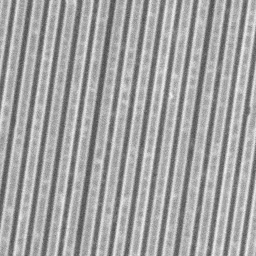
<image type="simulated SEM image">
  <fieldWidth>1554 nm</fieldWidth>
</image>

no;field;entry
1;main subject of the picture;parallel lines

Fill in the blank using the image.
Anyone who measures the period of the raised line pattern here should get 99.4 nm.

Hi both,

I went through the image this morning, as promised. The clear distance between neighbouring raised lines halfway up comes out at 0.042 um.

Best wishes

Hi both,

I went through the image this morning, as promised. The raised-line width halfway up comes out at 59.4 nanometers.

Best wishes